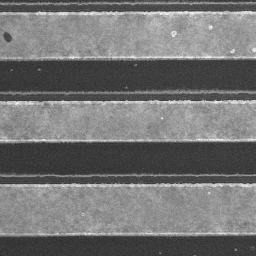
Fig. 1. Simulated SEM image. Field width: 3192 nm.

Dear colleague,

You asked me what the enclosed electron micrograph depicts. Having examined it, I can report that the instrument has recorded lines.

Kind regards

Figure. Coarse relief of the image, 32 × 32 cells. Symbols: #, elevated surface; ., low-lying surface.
................................
...................#...#....#.##
################################
################################
################################
################################
################################
................................
................................
................................
................................
................................
................................
################################
################################
################################
################################
################################
................................
................................
................................
................................
................................
################################
################################
################################
################################
################################
################################
................................
................................
................................